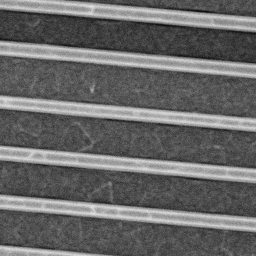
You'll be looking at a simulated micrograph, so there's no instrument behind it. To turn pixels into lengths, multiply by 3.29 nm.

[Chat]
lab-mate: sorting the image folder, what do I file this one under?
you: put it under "parallel lines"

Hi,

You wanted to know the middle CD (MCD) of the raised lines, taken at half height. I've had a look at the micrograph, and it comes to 0.0385 um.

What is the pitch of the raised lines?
50 pixels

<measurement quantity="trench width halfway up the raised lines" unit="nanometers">127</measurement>